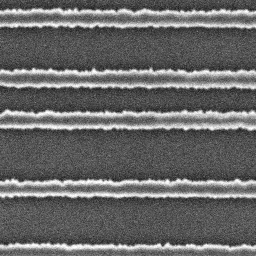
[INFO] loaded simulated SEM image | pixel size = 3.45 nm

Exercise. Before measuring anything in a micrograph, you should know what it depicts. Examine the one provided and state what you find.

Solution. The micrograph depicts lines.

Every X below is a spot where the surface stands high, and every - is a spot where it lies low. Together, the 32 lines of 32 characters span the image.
--------------------------------
XXXXXXXXXXXXXXXXXXXXXXX-X-XXXXX-
XXXXXXXXXXXXXXXXXXXXXXXXXXXXXXXX
--------------------------------
--------------------------------
--------------------------------
--------------------------------
--------------------------------
--------------------------------
XXXXXXXXXXXXXXXXXXXXXXXXXXXXXXXX
XXXXXXXXXXXXXXXXXXXXXXXXXXXXXXXX
--------------------------------
--------------------------------
--------------------------------
XXXXXXXXXXXXXXXXXXXXXXXXXXXXXXXX
XXXXXXXXXXXXXXXXXXXXXXXXXXXXXXXX
--------------------------------
--------------------------------
--------------------------------
--------------------------------
--------------------------------
--------------------------------
--------------------------------
XXXXXXXXXXXXXXXXXXXXXXXXXXXXXXXX
XX-XXX--XXXXXXXXXXXXXXXXXXXXXXXX
--------------------------------
--------------------------------
--------------------------------
--------------------------------
--------------------------------
--------------------------------
XXXXXXXXXXXXXXXXXXXXXXXXXXXXXXXX